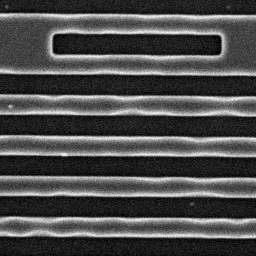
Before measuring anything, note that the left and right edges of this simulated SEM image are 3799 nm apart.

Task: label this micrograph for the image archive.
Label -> groups of lines, slits or small figures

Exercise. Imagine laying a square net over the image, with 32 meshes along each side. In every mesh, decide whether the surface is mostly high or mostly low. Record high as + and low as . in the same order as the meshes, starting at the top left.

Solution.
................................
................................
++++++++++++++++++++++++++++++++
++++++++++++++++++++++++++++++++
+++++++....................+++++
++++++......................++++
+++++++.....................++++
++++++++++++++++++++++++++++++++
++++++++++++++++++++++++++++++++
................................
................................
................................
++++++++++++++++++++++++++++++++
++++++++++++++++++++++++++++++++
................................
................................
................................
++++++++++++++++++++++++++++++++
++++++++++++++++++++++++++++++++
............................++++
................................
................................
++++++++++++++++++++++++++++++++
++++++++++++++++++++++++++++++++
...........................+++++
................................
................................
+++++++++++++++++++++++++++++.++
++++++++++++++++++++++++++++++++
.................++.++...+++++++
................................
................................